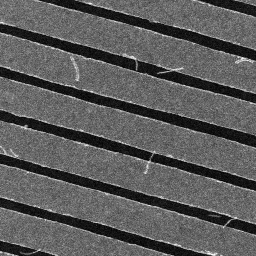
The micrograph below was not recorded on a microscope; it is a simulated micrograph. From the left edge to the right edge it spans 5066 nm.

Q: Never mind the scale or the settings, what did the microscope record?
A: parallel lines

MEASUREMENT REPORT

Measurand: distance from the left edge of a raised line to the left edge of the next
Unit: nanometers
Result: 831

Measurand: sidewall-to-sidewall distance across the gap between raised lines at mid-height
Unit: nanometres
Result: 193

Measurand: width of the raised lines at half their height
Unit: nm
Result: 637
